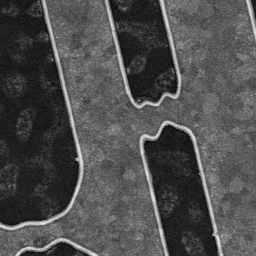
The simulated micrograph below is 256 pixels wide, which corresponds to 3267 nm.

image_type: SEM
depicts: one or a few lines or trenches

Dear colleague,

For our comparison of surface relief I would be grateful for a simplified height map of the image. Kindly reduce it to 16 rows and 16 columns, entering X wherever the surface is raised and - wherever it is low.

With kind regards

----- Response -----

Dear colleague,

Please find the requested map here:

---XXXX---XXXXXX
---XXXX---XXXXXX
---XXXX----XXXXX
----XXX----XXXXX
----XXXX---XXXXX
----XXXX---XXXXX
----XXXXXXXXXXXX
-----XXXXXXXXXXX
-----XXXXX--XXXX
-----XXXX---XXXX
-----XXXX----XXX
-----XXXX----XXX
-----XXXXX---XXX
----XXXXXX---XXX
XXXXXXXXXX---XXX
XXX--XXXXX----XX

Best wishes